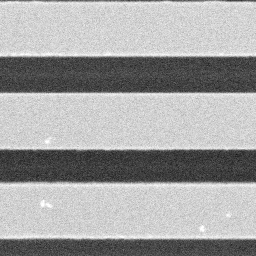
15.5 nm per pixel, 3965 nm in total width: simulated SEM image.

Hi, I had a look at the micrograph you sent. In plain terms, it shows lines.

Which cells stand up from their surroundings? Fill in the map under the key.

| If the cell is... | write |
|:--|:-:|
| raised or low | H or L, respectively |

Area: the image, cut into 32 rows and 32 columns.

HHHHHHHHHHHHHHHHHHHHHHHHHHHHHHHH
HHHHHHHHHHHHHHHHHHHHHHHHHHHHHHHH
HHHHHHHHHHHHHHHHHHHHHHHHHHHHHHHH
HHHHHHHHHHHHHHHHHHHHHHHHHHHHHHHH
HHHHHHHHHHHHHHHHHHHHHHHHHHHHHHHH
HHHHHHHHHHHHHHHHHHHHHHHHHHHHHHHH
HHHHHHHHHHHHHHHHHHHHHHHHHHHHHHHH
LLLLLLLLLLLLLLLLLLLLLLLLLLLLLLLL
LLLLLLLLLLLLLLLLLLLLLLLLLLLLLLLL
LLLLLLLLLLLLLLLLLLLLLLLLLLLLLLLL
LLLLLLLLLLLLLLLLLLLLLLLLLLLLLLLL
LLLLLLLLLLLLLLLLLLLLLLLLLLLLLLLL
HHHHHHHHHHHHHHHHHHHHHHHHHHHHHHHH
HHHHHHHHHHHHHHHHHHHHHHHHHHHHHHHH
HHHHHHHHHHHHHHHHHHHHHHHHHHHHHHHH
HHHHHHHHHHHHHHHHHHHHHHHHHHHHHHHH
HHHHHHHHHHHHHHHHHHHHHHHHHHHHHHHH
HHHHHHHHHHHHHHHHHHHHHHHHHHHHHHHH
HHHHHHHHHHHHHHHHHHHHHHHHHHHHHHHH
LLLLLLLLLLLLLLLLLLLLLLLLLLLLLLLL
LLLLLLLLLLLLLLLLLLLLLLLLLLLLLLLL
LLLLLLLLLLLLLLLLLLLLLLLLLLLLLLLL
LLLLLLLLLLLLLLLLLLLLLLLLLLLLLLLL
HHHHHHHHHHHHHHHHHHHHHHHHHHHHHHHH
HHHHHHHHHHHHHHHHHHHHHHHHHHHHHHHH
HHHHHHHHHHHHHHHHHHHHHHHHHHHHHHHH
HHHHHHHHHHHHHHHHHHHHHHHHHHHHHHHH
HHHHHHHHHHHHHHHHHHHHHHHHHHHHHHHH
HHHHHHHHHHHHHHHHHHHHHHHHHHHHHHHH
HHHHHHHHHHHHHHHHHHHHHHHHHHHHHHHH
LLLLLLLLLLLLLLLLLLLLLLLLLLLLLLLL
LLLLLLLLLLLLLLLLLLLLLLLLLLLLLLLL